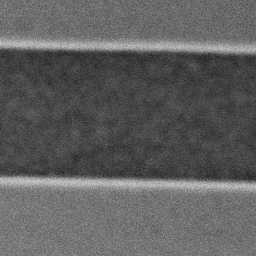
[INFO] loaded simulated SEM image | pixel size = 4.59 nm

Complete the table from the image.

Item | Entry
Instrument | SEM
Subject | one or a few lines or trenches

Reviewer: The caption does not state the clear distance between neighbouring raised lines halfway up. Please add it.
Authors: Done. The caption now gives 619 nanometres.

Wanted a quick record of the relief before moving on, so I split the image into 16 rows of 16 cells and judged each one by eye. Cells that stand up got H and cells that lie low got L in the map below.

HHHHHHHHHHHHHHHH
HHHHHHHHHHHHHHHH
HHHHHHHHHHHHHHHH
LLLLLLLLLLLLLLLL
LLLLLLLLLLLLLLLL
LLLLLLLLLLLLLLLL
LLLLLLLLLLLLLLLL
LLLLLLLLLLLLLLLL
LLLLLLLLLLLLLLLL
LLLLLLLLLLLLLLLL
LLLLLLLLLLLLLLLL
HHHHHHHHHHHLLLLL
HHHHHHHHHHHHHHHH
HHHHHHHHHHHHHHHH
HHHHHHHHHHHHHHHH
HHHHHHHHHHHHHHHH